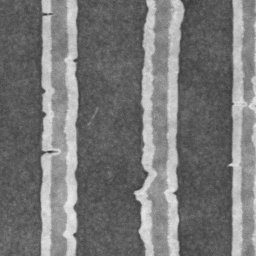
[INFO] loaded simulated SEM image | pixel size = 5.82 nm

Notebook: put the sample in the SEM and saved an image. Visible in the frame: one or a few lines or trenches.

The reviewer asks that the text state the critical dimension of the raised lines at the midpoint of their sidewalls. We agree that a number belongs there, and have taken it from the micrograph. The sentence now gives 154 nanometers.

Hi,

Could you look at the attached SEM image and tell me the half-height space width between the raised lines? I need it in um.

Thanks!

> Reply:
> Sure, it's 0.393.